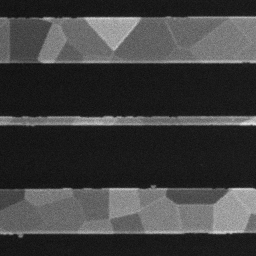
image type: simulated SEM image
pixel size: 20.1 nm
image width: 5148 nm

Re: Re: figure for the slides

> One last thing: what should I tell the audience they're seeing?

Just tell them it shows lines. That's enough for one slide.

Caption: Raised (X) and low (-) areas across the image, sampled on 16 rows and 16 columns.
----------------
XXXXXXXXXXXXXXXX
XXXXXXXXXXXXXXXX
XXXXXXXXXXXXXXXX
----------------
----------------
----------------
----------------
----------------
----------------
----------------
----------------
XXXXXXXXXXXXXXXX
XXXXXXXXXXXXXXXX
XXXXXXXXXXXXXXXX
----------------